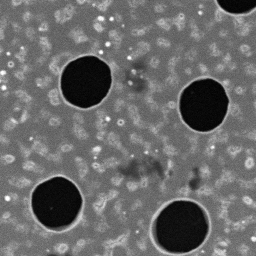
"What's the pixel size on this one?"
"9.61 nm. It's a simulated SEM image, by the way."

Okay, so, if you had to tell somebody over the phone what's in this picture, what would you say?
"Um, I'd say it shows holes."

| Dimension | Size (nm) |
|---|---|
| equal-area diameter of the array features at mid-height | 493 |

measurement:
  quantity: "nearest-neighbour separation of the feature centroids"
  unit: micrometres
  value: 1.17